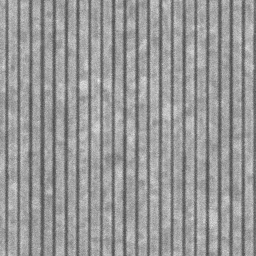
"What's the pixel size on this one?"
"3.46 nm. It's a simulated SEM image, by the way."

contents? parallel lines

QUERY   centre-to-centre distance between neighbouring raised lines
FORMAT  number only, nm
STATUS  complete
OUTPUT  40.9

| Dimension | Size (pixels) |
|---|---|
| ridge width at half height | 7.51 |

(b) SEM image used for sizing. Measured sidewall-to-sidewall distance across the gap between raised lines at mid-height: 13 nm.